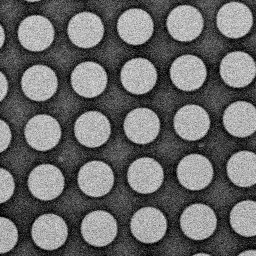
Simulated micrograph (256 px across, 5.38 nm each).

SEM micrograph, an array of small figures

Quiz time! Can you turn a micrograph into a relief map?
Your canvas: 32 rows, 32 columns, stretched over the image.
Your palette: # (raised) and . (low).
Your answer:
............................##..
................##...####..####.
...###...###...####..####..#####
..#####..####..####..####..####.
..#####..####..####...###...##..
...###...###....#...............
.............................#..
................##....###...####
....##...####..####..#####..####
...####..####..#####.#####..####
#..####..####..####...###....##.
#..####...###...##..............
....##..........................
.......................##...####
.....#....###...####..####..####
#..####..#####..####..####..####
#..#####.#####..####..####...###
#..####...###...###.............
#...##..........................
.......................##....###
...........##....###..####..####
#...####..####..####..#####.####
##..####..####..####..####...###
##..####..####...###...##.......
#...###....##...................
..............................##
............#....###...####..###
#....###..####..#####..####..###
##..####..#####.#####..####..###
##..####..####...###...###......
##...###...##...................
#.............................##